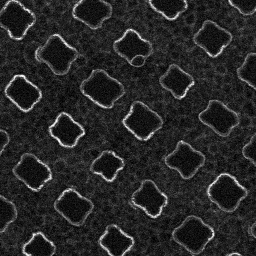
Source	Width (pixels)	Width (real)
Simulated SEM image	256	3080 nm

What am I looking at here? a regular array of raised bodies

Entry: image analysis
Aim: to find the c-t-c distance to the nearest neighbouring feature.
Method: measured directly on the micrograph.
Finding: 634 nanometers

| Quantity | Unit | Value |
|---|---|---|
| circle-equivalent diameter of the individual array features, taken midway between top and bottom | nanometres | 384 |